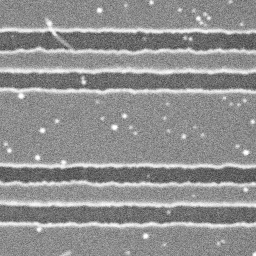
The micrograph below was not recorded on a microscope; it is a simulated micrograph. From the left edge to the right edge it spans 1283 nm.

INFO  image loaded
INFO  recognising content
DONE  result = lines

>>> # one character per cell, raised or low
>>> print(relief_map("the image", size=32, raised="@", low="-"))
@@@@@@@@@@@@@@@@@@@@@@@@@@@@@@@@
@@@@@@@@@@@@@@@@@@@@@@@@@@@@@@@@
@@@@@@@@@@@@@@@@@@@@@@@@@@@@@@@@
@@@@@@@@@@@@@@@@@@@@@@@@@@@@@@@@
--------------------------------
--------------------------------
@@@@@@@@@@@@@@@@@@@@@@@@@@@@@@@@
@@@@@@@@@@@@@@@@@@@@@@@@@@@@@@@@
@@@@@@@@@@@@@@@@@@@@@@@@@@@@@@@@
--------------------------------
--------------------------------
@@@@@@@@@@@@@@@@@@@@@@@@@@@@@@@@
@@@@@@@@@@@@@@@@@@@@@@@@@@@@@@@@
@@@@@@@@@@@@@@@@@@@@@@@@@@@@@@@@
@@@@@@@@@@@@@@@@@@@@@@@@@@@@@@@@
@@@@@@@@@@@@@@@@@@@@@@@@@@@@@@@@
@@@@@@@@@@@@@@@@@@@@@@@@@@@@@@@@
@@@@@@@@@@@@@@@@@@@@@@@@@@@@@@@@
@@@@@@@@@@@@@@@@@@@@@@@@@@@@@@@@
@@@@@@@@@@@@@@@@@@@@@@@@@@@@@@@@
@@@@@@@@@@@@@@@@@@@@@@@@@@@@@@@@
--------------------------------
--------------------------------
@@@@@@@@@@@@@@@@@@@@@@@@@@@@@@@@
@@@@@@@@@@@@@@@@@@@@@@@@@@@@@@@@
-@@@@@@@@@@@@@@@@@@@@@@@@@@@@@@@
--------------------------------
--------------------------------
@@@@@@@@@@@@@@@@@@@@@@@@@@@@@@@@
@@@@@@@@@@@@@@@@@@@@@@@@@@@@@@@@
@@@@@@@@@@@@@@@@@@@@@@@@@@@@@@@@
@@@@@@@@@@@@@@@@@@@@@@@@@@@@@@@@